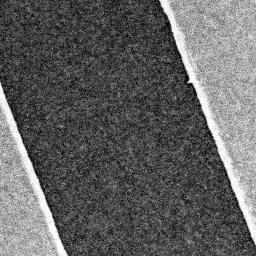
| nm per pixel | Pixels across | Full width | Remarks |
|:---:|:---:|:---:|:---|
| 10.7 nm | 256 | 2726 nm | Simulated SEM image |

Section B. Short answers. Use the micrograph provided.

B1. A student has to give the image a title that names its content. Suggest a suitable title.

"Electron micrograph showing one or a few lines or trenches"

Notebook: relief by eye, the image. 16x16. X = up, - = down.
----------XXXXXX
-----------XXXXX
-----------XXXXX
-----------XXXXX
------------XXXX
------------XXXX
-------------XXX
X------------XXX
X-------------XX
X-------------XX
XX------------XX
XX-------------X
XXX------------X
XXX------------X
XXX-------------
XXXX------------